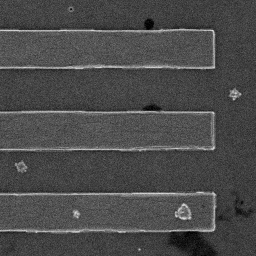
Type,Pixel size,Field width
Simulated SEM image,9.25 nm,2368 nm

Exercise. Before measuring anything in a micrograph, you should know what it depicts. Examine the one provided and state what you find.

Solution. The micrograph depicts wiring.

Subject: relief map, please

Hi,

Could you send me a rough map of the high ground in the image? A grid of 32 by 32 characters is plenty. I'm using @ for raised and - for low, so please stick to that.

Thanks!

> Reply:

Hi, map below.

--------------------------------
--------------------------------
--------------------------------
--------------------------------
@@@@@@@@@@@@@@@@@@@@@@@@@@@-----
@@@@@@@@@@@@@@@@@@@@@@@@@@@-----
@@@@@@@@@@@@@@@@@@@@@@@@@@@-----
@@@@@@@@@@@@@@@@@@@@@@@@@@@-----
--------------------------------
--------------------------------
--------------------------------
--------------------------------
--------------------------------
--------------------------------
@@@@@@@@@@@@@@@@@@@@@@@@@@@-----
@@@@@@@@@@@@@@@@@@@@@@@@@@@-----
@@@@@@@@@@@@@@@@@@@@@@@@@@@-----
@@@@@@@@@@@@@@@@@@@@@@@@@@@-----
@@@@@@@@@@@@@@@@@@@@@@@@@@------
--------------------------------
--------------------------------
--------------------------------
--------------------------------
--------------------------------
@@@@@@@@@@@@@@@@@@@@@@@@@@@-----
@@@@@@@@@@@@@@@@@@@@@@@@@@@-----
@@@@@@@@@@@@@@@@@@@@@@@@@@@-----
@@@@@@@@@@@@@@@@@@@@@@@@@@@-----
@@@@@@@@@@@@@@@@@@@@@@@@@@@-----
--------------------------------
--------------------------------
--------------------------------